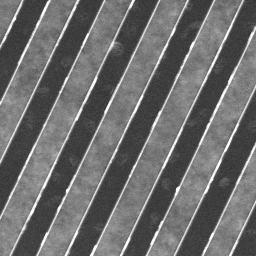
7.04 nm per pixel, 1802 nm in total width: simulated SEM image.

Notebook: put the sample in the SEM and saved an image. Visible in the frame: parallel lines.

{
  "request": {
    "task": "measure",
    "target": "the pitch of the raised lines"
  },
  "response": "349 nm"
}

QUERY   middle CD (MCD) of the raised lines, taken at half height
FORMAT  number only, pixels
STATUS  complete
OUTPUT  24.7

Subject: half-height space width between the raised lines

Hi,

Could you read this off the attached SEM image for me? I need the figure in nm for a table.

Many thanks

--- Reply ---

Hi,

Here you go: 173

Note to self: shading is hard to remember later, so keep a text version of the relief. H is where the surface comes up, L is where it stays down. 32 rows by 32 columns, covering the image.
LLLHHHLLLHHHHLLLHHHHLLLHHHHLLLHH
LLHHHHLLLHHHLLLLHHHLLLLHHHLLLLHH
LLHHHLLLLHHHLLLHHHHLLLHHHHLLLHHH
LHHHHLLLHHHLLLLHHHLLLLHHHLLLLHHH
LHHHLLLLHHHLLLHHHHLLLHHHHLLLHHHL
HHHHLLLHHHHLLLLHHLLLLHHHLLLLHHHL
HHHLLLLHHHLLLLLHHLLLHHHHLLLHHHHL
HHHLLLHHHHLLLHHHLLLLHHHLLLLHHHLL
HHLLLLHHHLLLLHHHLLLHHHHLLLHHHHLL
HHLLLHHHHLLLHHHLLLLHHHLLLLHHHLLL
HLLLLHHHLLLLHHHLLLHHHHLLLHHHHLLL
HLLLHHHHLLLHHHLLLLHHHLLLLHHHLLLL
LLLLHHHLLLLHHHLLLHHHHLLLHHHHLLLH
LLLHHHHLLLHHHHLLLHHHLLLLHHHLLLLH
LLLHHHLLLLHHHLLLHHHHLLLHHHHLLLHH
LLHHHHLLLHHHHLLLHHHLLLLHHHLLLLHH
LLHHHLLLLHHHLLLLHHHLLLHHHHLLLHHH
LHHHHLLLHHHHLLLHHHHLLLHHHLLLLHHH
LHHHLLLLHHHLLLLHHHLLLHHHHLLLHHHH
HHHHLLLHHHHLLLHHHHLLLHHHLLLLHHHL
HHHLLLLHHHLLLLHHHLLLLHHHLLLHHHHL
HHHLLLHHHHLLLHHHHLLLHHHLLLLHHHLL
HHLLLLHHHLLLLHHHLLLLHHHLLLHHHHLL
HHLLLHHHHLLLHHHHLLLHHHLLLLHHHLLL
HLLLLHHHLLLLHHHLLLLHHHLLLHHHHLLL
HLLLHHHHLLLHHHHLLLHHHLLLLHHHLLLL
LLLLHHHLLLLHHHLLLLHHHLLLHHHHLLLH
LLLHHHHLLLHHHHLLLHHHHLLLHHHHLLLH
LLLHHHLLLLHHHLLLLHHHLLLHHHHLLLHH
LLHHHHLLLHHHHLLLHHHLLLLHHHHLLLHH
LLHHHLLLLHHHLLLLHHHLLLHHHHLLLHHH
LLHHHLLLHHHHLLLHHHHLLLHHHHLLLHHH